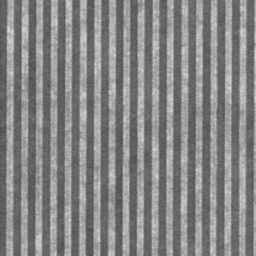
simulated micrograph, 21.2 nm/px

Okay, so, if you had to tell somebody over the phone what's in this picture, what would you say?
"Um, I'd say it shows parallel lines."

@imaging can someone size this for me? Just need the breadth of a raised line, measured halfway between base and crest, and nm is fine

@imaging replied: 122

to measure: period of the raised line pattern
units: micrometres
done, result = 0.308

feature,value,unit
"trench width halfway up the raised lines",8.5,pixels